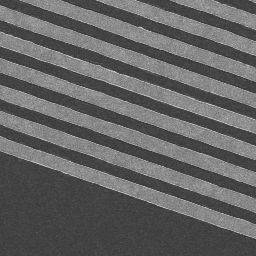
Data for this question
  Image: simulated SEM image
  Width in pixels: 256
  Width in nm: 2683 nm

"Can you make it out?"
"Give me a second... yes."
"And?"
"parallel lines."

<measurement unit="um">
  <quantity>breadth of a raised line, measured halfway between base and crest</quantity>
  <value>0.139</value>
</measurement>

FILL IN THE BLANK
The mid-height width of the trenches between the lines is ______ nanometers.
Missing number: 124